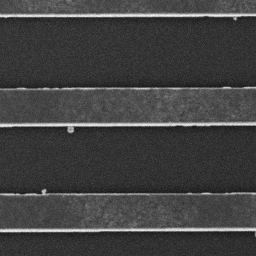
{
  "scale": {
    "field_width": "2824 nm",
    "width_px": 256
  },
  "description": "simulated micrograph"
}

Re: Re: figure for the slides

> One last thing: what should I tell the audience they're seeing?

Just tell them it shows lines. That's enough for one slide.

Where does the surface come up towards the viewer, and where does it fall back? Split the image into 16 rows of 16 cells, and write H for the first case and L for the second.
HHHHHHHHHHHHHHHH
LLLLLLLLLLLLLLLL
LLLLLLLLLLLLLLLL
LLLLLLLLLLLLLLLL
LLLLLLLLLLLLLLLL
LLLLLLLLLLLLLHHH
HHHHHHHHHHHHHHHH
HHHHHHHHHHHHHHHH
LLLLLLLLLLLLLLLL
LLLLLLLLLLLLLLLL
LLLLLLLLLLLLLLLL
LLLLLLLLLLLLLLLL
HHHHHHHHHHHHHHHH
HHHHHHHHHHHHHHHH
LLLLLLLLLLLLLLLL
LLLLLLLLLLLLLLLL